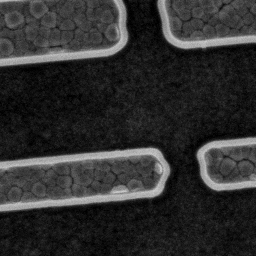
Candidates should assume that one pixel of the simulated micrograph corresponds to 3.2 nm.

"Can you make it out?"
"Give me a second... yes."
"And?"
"one or a few lines or trenches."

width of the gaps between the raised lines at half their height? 323 nm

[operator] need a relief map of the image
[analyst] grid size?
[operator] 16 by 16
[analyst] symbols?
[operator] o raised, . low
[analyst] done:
oooooooo..oooooo
oooooooo..oooooo
oooooooo...ooooo
ooooo...........
................
................
................
................
................
........o....ooo
oooooooooo...ooo
oooooooooo...ooo
oooooo..........
................
................
................